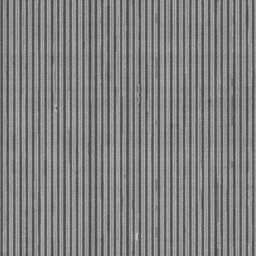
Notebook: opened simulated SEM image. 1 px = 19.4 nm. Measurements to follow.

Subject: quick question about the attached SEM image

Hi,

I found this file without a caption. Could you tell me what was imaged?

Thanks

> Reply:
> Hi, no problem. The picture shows parallel lines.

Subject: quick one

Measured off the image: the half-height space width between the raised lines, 72.9 nm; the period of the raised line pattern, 6.27 px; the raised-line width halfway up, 53.5 nm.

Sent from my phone